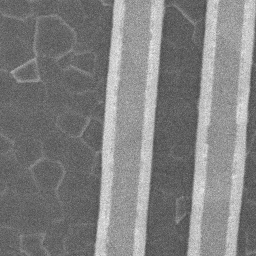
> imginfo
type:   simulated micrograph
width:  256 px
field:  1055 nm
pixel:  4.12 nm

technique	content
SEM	one or a few lines or trenches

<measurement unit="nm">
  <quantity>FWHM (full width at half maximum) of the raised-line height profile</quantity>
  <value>163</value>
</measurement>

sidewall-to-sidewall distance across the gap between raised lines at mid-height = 215 nanometers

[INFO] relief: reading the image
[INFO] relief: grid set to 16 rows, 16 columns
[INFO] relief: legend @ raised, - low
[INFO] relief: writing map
-------@@@---@@@
-------@@@---@@@
-------@@@---@@@
-------@@@---@@-
-------@@@---@@-
-------@@@---@@-
-------@@----@@-
-------@@----@@-
-------@@----@@-
-------@@----@@-
-------@@---@@@-
-------@@---@@@-
-------@@---@@@-
------@@@---@@@-
------@@@---@@@-
------@@@---@@--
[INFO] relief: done